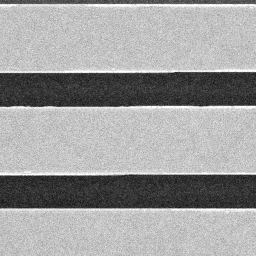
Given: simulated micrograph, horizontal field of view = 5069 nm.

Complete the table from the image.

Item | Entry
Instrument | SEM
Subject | lines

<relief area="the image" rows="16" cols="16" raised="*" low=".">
****************
****************
****************
****************
***********.....
................
................
****************
****************
****************
****************
................
................
****************
****************
****************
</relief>